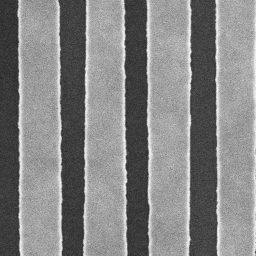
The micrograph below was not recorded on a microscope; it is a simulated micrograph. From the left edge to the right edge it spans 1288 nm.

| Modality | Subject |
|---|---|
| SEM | lines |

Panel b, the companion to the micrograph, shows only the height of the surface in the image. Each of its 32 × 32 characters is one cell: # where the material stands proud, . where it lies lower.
..#####....####...######...#####
..#####....#####..######...#####
..#####....#####..######...#####
..#####....#####..######...#####
..#####....#####..######...#####
..######...#####..######...#####
..######...#####..######...#####
..######...#####..######...#####
..######...#####..######...#####
..######...#####..######...#####
..######...#####..######...#####
..######...#####...#####...#####
..######...#####..######...#####
..######...#####..######...#####
..######...#####..######...#####
..######...#####..######...#####
..######...#####...#####...#####
..######...#####...#####...#####
..######...#####...#####...#####
..######...#####...#####...#####
...#####...#####...#####...#####
...#####...#####...#####...#####
..######...#####...#####...#####
..######...#####...#####...#####
..######...#####...#####...#####
..######...#####...#####...#####
..######..######...#####...#####
..######..######...#####...#####
..######..######...#####...#####
...#####...#####...#####...#####
...#####..######...#####...#####
...#####..######...#####...#####